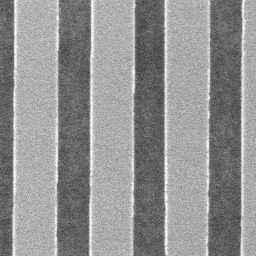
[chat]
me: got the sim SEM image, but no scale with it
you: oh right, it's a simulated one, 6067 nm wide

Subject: lines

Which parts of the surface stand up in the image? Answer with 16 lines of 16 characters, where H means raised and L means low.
LHHHLLHHLLHHHLLH
LHHHLLHHLLHHHLLH
LHHHLLHHLLHHHLLH
LHHHLLHHLLHHHLLH
LHHHLLHHLLHHHLLH
LHHHLLHHLLHHHLLH
LHHHLLHHLLHHHLLH
LHHHLLHHLLHHHLLH
LHHHLLHHLLHHHLLH
LHHHLLHHLLHHHLLH
LHHHLLHHLLHHHLLH
LHHHLLHHLLHHHLLH
LHHHLLHHLLHHHLLH
LHHHLLHHLLHHHLLH
LHHHLLHHLLHHHLLH
LHHHLLHHLLHHHLLH